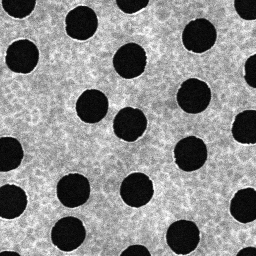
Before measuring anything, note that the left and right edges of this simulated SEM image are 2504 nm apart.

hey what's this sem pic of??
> a regular array of holes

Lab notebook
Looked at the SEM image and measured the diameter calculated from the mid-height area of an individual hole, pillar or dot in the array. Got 338 nm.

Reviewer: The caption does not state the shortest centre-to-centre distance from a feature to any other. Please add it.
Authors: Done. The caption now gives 572 nm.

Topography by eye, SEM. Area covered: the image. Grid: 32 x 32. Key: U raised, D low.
DDDDUUUUUUUUUUUDDDUUUUUUUUUUUDDD
UDDDUUUUUDDDUUUDDUUUUUUUUUUUUUDD
UUUUUUUUDDDDUUUUUUUUUUUUDDUUUUUD
UUUUUUUUDDDDUUUUUUUUUUUDDDDUUUUU
UUUUUUUUUDDDUUUUUUUUUUUDDDDUUUUU
UDDDUUUUUUUUUUUUDUUUUUUDDDDUUUUU
UDDDDUUUUUUUUUUDDDUUUUUUDUUUUUUU
UDDDDUUUUUUUUUDDDDUUUUUUUUUUUUUD
UDDDUUUUUUUUUUDDDDUUUUUUUUUUUUUD
UUUUUUUUUUUUUUUDDUUUUUUUUUUUUUUD
UUUUUUUUUUUUUUUUUUUUUUUDDDUUUUUD
UUUUUUUUUUDDDUUUUUUUUUDDDDUUUUUU
UUUUUUUUUUDDDUUUUUUUUUDDDDUUUUUU
UUUUUUUUUDDDDDUDDUUUUUUDDDUUUUUU
UUUUUUUUUUDDDUDDDDUUUUUUUUUUUUDD
UUUUUUUUUUUUUUDDDDUUUUUUUUUUUDDD
UUUUUUUUUUUUUUDDDDUUUUUUUUUUUDDD
DDUUUUUUUUUUUUUDDUUUUUUDDUUUUDDD
DDDUUUUUUUUUUUUUUUUUUUDDDDUUUUUU
DDDUUUUUUUUUUUUUUUUUUUDDDDUUUUUU
DDDUUUUUUUUUUUUUUUUUUUDDDUUUUUUU
UUUUUUUUUUUUUUUUUUUUUUUUUUUUUUUU
UUUUUUUDDDDUUUUDDDDUUUUUUUUUUUUU
DDDUUUUDDDDUUUUDDDDUUUUUUUUUUUUU
DDDUUUUDDDDUUUUDDDDUUUUUUUUUUDDD
DDDUUUUUDDUUUUUUDDUUUUUUUUUUUDDD
DDDUUUUUUUUUUUUUUUUUUUUUUUUUUDDD
UUUUUUUDDDUUUUUUUUUUUUUUUUUUUUDD
UUUUUUUDDDDUUUUUUUUUUDDDDUUUUUUU
UUUUUUDDDDDUUUUUUUUUUDDDDUUUUUUU
UUUUUUUDDDUUUUUUUUUUUDDDDUUUUUUU
DDUUUUUUUUUUUUUDDDDUUUDDUUUUUUDD